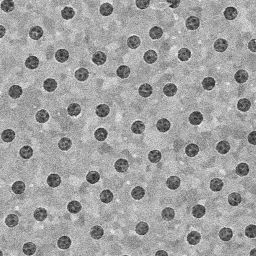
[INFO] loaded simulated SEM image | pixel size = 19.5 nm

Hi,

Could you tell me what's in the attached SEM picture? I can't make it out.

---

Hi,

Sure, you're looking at a regular array of holes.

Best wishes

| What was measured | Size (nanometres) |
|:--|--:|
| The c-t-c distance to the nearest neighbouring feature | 569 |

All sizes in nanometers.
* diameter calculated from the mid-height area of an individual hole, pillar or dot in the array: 252